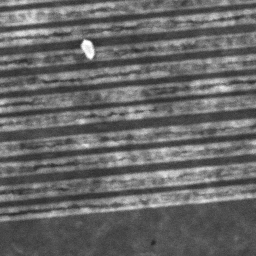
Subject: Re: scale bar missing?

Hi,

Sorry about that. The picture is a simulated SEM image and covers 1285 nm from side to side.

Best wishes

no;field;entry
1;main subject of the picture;parallel lines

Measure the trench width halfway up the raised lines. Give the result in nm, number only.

43.1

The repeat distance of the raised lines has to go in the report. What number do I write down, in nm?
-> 108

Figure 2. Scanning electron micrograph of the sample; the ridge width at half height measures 0.0618 um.